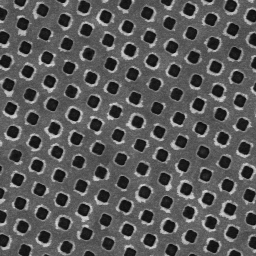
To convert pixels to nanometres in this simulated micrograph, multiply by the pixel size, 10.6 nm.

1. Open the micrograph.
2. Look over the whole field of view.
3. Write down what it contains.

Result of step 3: a regular array of holes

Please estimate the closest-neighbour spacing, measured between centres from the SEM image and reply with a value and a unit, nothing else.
249 nanometres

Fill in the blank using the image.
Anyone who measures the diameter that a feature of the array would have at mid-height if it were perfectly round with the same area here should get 132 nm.